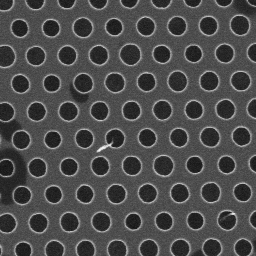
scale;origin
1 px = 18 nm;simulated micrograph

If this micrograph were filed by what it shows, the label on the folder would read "a regular array of holes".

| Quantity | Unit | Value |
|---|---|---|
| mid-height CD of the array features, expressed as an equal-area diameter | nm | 324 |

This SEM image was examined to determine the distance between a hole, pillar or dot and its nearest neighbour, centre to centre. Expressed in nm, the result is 563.